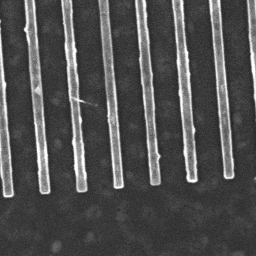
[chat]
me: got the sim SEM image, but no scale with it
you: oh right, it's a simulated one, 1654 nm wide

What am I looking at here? parallel lines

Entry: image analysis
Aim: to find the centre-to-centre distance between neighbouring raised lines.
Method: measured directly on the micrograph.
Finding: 238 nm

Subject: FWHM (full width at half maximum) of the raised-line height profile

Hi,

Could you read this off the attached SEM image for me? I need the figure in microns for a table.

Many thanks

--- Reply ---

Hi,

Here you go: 0.0643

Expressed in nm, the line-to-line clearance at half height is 170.